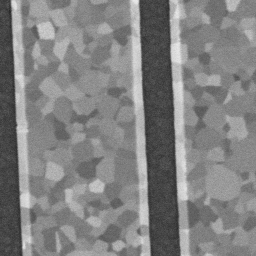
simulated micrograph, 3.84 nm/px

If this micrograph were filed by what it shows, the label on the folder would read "one or a few lines or trenches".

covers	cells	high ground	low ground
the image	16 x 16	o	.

.ooooooo...ooooo
.ooooooo...ooooo
.ooooooo...ooooo
.oooooooo..ooooo
.oooooooo..ooooo
.oooooooo..ooooo
.oooooooo..ooooo
.oooooooo..ooooo
.oooooooo..ooooo
.oooooooo..ooooo
.oooooooo..ooooo
.oooooooo..ooooo
..ooooooo..ooooo
..ooooooo..ooooo
..ooooooo..ooooo
..ooooooo...oooo